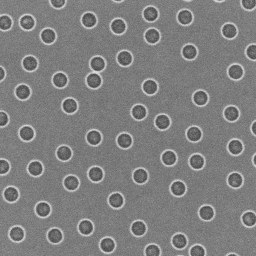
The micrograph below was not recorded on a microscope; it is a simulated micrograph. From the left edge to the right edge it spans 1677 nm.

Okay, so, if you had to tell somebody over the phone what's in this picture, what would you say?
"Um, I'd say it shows a regular array of holes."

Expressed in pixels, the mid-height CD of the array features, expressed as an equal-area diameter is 15.3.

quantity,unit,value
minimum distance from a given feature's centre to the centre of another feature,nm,195